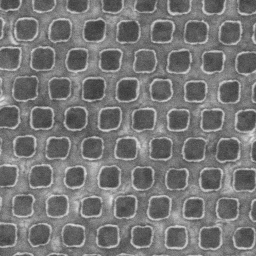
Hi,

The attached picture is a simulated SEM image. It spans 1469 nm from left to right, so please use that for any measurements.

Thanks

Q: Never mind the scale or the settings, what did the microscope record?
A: a regular array of raised bodies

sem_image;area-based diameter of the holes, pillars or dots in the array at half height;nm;137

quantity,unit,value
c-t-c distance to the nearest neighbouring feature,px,33.3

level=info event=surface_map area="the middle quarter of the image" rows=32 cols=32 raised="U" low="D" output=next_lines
DUUUUUDDDUUUUUDDDDUUUUUDDDUUUUUD
DUUUUDDDDUUUUDDDDDUUUUUDDDUUUUUD
DDDDDDDDDDDDDDDDDDDDDDDDDDDDDDDD
DDDDDDDUUDDDDDDDDDDDDDDDDDDDDDDD
UUDDDUUUUUDDDDUUUUUDDDUUUUUDDDDU
UUDDDUUUUUDDDUUUUUUDDDUUUUUDDDUU
UUDDDUUUUUDDDUUUUUUDDUUUUUUDDDUU
UUDDDUUUUUDDDUUUUUDDDDUUUUUDDDUU
UDDDDUUUUUDDDUUUUUDDDDUUUUDDDDUU
DDDDDDDDDDDDDDDDDDDDDDDDDDDDDDDU
DDDDDDDDDDDDDDDDDDDDDDDDDDDDDDDD
DUUUUDDDDUUUUUDDDDDUUUDDDDDUUUUD
UUUUUUDDDUUUUUDDDUUUUUUDDDUUUUUD
UUUUUUDDDUUUUUDDDUUUUUUDDDUUUUUD
UUUUUUDDDUUUUUDDDUUUUUUDDDUUUUUD
UUUUUDDDUUUUUUDDDUUUUUUDDDUUUUUD
DDUUDDDDDUUDDDDDDUUUDDDDDDDUUDDD
DDDDDDDDDDDDDDDDDDDDDDDDDDDDDDDD
UDDDDDUDDDDDDDDDUUDDDDDDUUDDDDDU
UDDDDUUUUUDDDUUUUUDDDDUUUUUDDDUU
UDDDUUUUUUDDDUUUUUDDDUUUUUUDDDUU
UDDDUUUUUUDDDUUUUUDDDUUUUUUDDDUU
UDDDUUUUUUDDDUUUUUDDDUUUUUUDDDUU
DDDDDUUUUDDDDUUUUUDDDDUUUUDDDDUU
DDDDDDDDDDDDDDDDDDDDDDDDDDDDDDDD
DDDDDDDDDDUDDDDDDDDDDDDDDDDDDDDD
DUUUUDDDDUUUUUDDDUUUUUDDDDUUUUDD
UUUUUDDDDUUUUUDDDUUUUUDDDDUUUUUD
UUUUUDDDDUUUUUDDDUUUUUDDDUUUUUUD
UUUUUDDDDUUUUUDDDUUUUUDDDUUUUUUD
DUUUDDDDDUUUUUDDDUUUUUDDDDUUUUUD
DDDDDDDDDDDDDDDDDDDDDDDDDDDDDDDD